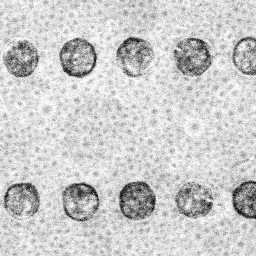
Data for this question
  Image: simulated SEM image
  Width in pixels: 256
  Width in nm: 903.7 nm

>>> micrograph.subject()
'a regular array of holes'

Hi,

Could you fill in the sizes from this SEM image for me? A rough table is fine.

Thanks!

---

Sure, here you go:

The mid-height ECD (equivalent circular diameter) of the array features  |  38.8 px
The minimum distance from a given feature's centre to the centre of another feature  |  201 nm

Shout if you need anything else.